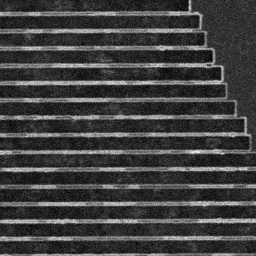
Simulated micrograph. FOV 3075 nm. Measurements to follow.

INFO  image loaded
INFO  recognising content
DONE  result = parallel lines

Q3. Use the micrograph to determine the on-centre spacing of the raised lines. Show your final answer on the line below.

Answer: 208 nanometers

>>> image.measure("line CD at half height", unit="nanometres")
34.5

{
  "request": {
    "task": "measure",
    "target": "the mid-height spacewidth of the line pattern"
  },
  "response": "173 nm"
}